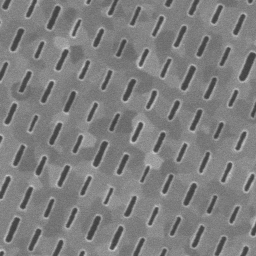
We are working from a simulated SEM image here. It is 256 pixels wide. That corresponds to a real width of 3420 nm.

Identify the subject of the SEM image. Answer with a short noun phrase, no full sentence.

a regular array of holes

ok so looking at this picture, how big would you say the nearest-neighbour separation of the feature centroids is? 326 nanometers